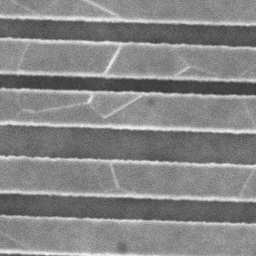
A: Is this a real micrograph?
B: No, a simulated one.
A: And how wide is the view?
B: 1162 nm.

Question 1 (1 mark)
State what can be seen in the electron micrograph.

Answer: lines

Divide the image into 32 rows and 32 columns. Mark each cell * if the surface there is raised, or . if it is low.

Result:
********************************
********************************
........************************
................................
................................
*******************.*...........
********************************
********************************
********************************
.........***********************
................................
*****************...............
********************************
********************************
********************************
..******************************
.............................***
................................
................................
................................
************************..*.....
********************************
********************************
********************************
...............*****************
................................
................................
***************.................
********************************
********************************
********************************
********************************